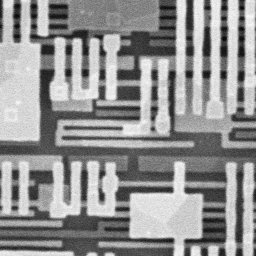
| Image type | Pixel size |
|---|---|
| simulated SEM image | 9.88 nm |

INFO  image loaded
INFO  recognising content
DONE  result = wiring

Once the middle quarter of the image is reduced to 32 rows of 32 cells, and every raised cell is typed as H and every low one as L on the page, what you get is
LLHHLLHHHLLHHLLLLLLHHHLLHHLLHHLL
LLHHLLHHHLLHHLLLLLLHHHLLHHLLHHLL
LLHHLLHHHLLHHLLLLLLHHHLLHHLLHHLL
LLHHLLHHHLLHHLLLLLLHHHLLHHLLHHLL
LLHHLLHHLLLHHLLLLLLHHHLLHHLLHHLL
HLHHLLHHLLLHHLLLLLLHHHLLHHLLHHLL
HLHHHLHHLLLHHLLLLLLHHHLLHHLLHHLL
HLHHHHHHLLLHHLLLLLLHHHLLHHLLHHLL
HLHHHHLLLLLHHLLLLLLHHHLLHHLLHHLL
LLLLLLLLLLLLLLLLLLLHHHLLHHLLHHLL
LLLLLLLLLLLLLLLLLLLHHLLLHHLLHHLL
LLLLLLLLLLLLLLLLLLLHHLLLHHLLHHLL
LLLLLLLLLLLLLLLLLLLHHLLLHHLLHHLL
LLLLLLLLLLLLLLLLLLLHHHLHHHLLLLLL
LLLLLLLLLLLLLLLLLLLHHHLHHHLLLLLL
LLLLLLLLLLLLLLLHHLHHHHLHHHLLLLLL
LLLLLLLLLLLLLLLHHHHHHLLHHHLLLLLL
LLLLLLLLLLLLLLLLLLLLLLLLLLLLLLLL
LLLLLLLLLLLLLLLLLLLLLLLLLLLLLLLL
LLLLLLLLLLLLLLLLLLLLLLLLLLLLLLLL
LLLLLLLLLLLLLLLLLLLLLLLLLLLLLLLL
LLLLLLLLLLLLLLLLLLLLLLLLLLLLLLLL
LLLLLLLLLLLLLLLLLLLLLLLLLLLLLLLL
LLLLLLLLLLLLLLLLLLLLLLLLLLLLLLLL
LLLLLLHHLLLLLLLLLLLLLLLLLLLLLLLL
LLHHLLHHHLLHHLLLLLLLLLLLLLLLHHLL
LLHHLLHHHLLHHLLLLLLLLLLLLLLLHHLL
LLHHLLHHHLLHHLLLLLLLLLLLLLLLHHLL
LLHHLLHHLLHHHLLLLLLLLLLLLLLLHHLL
LLHHLLHHLLHHHLLLLLLLLLLLLLLLHHLL
LLHHLLHHLLHHHLLLLLLLLLLLLLLLHHLL
LLHHLLHHLLHHHLLLLLLLLLLLLLLLHHLL